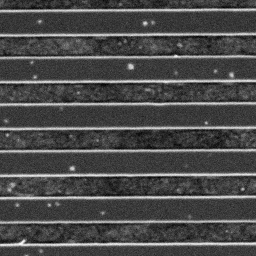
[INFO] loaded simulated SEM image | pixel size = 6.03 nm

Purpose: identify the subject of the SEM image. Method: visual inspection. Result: parallel lines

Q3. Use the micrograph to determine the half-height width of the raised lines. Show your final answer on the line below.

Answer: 24.8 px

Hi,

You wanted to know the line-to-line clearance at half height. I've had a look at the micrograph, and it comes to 0.133 microns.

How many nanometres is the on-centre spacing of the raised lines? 282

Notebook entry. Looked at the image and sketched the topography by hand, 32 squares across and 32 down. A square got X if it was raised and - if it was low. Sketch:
--------------------------------
XXXXXXXXXXXXXXXXXXXXXXXXXXXXXXXX
XXXXXXXXXXXXXXXXXXXXXXXXXXXXXXXX
XXXXXXXXXXXXXXXXXXXXXXXXXXXXXXXX
--------------------------------
--------------------------------
--------------------------------
XXXXXXXXXXXXXXXXXXXXXXXXXXXXXXXX
XXXXXXXXXXXXXXXXXXXXXXXXXXXXXXXX
XXXXXXXXXXXXXXXXXXXXXXXXXXXXXXXX
--------------------------------
--------------------------------
--------------------------------
XXXXXXXXXXXXXXXXXXXXXXXXXXXXXXXX
XXXXXXXXXXXXXXXXXXXXXXXXXXXXXXXX
XXXXXXXXXXXXXXXXXXXXXXXXXXXXXXXX
--------------------------------
--------------------------------
--------------------------------
XXXXXXXXXXXXXXXXXXXXXXXXXXXXXXXX
XXXXXXXXXXXXXXXXXXXXXXXXXXXXXXXX
XXXXXXXXXXXXXXXXXXXXXXXXXXXXXXXX
--------------------------------
--------------------------------
--------------------------------
XXXXXXXXXXXXXXXXXXXXXXXXXXXXXXXX
XXXXXXXXXXXXXXXXXXXXXXXXXXXXXXXX
XXXXXXXXXXXXXXXXXXXXXXXXXXXXXXXX
--------------------------------
--------------------------------
--X------XXXXXXXXX---XXX-XXX---X
XXXXXXXXXXXXXXXXXXXXXXXXXXXXXXXX